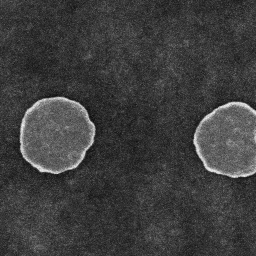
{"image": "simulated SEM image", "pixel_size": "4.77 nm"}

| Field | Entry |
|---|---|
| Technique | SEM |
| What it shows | raised bodies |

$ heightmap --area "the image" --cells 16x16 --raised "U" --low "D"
DDDDDDDDDDDDDDDD
DDDDDDDDDDDDDDDD
DDDDDDDDDDDDDDDD
DDDDDDDDDDDDDDDD
DDDDDDDDDDDDDDDD
DDDDDDDDDDDDDDDD
DDUUUDDDDDDDDDUD
DUUUUUDDDDDDDUUU
DUUUUUDDDDDDUUUU
DUUUUDDDDDDDUUUU
DDUUDDDDDDDDDUUU
DDDDDDDDDDDDDDDD
DDDDDDDDDDDDDDDD
DDDDDDDDDDDDDDDD
DDDDDDDDDDDDDDDD
DDDDDDDDDDDDDDDD